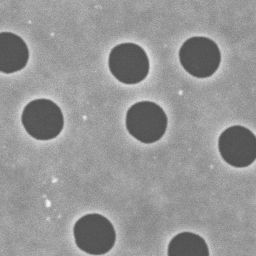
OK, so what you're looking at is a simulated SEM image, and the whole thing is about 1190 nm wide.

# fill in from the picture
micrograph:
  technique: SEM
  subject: holes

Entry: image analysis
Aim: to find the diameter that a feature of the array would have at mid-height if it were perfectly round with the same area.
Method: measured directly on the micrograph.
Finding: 197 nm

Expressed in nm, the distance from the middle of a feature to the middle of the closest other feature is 333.